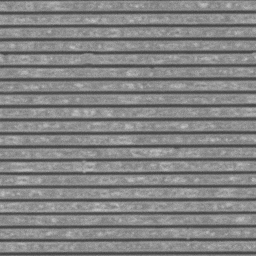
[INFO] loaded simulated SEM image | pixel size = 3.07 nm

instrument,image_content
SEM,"parallel lines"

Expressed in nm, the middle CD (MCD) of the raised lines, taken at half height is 30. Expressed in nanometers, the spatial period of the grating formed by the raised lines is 41.1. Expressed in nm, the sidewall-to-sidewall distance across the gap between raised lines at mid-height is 11.9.